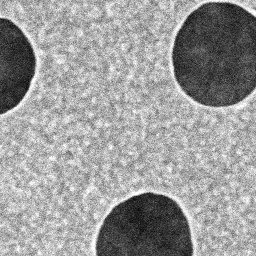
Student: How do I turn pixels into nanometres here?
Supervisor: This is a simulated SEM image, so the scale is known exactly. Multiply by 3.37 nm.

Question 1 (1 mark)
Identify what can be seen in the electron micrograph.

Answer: holes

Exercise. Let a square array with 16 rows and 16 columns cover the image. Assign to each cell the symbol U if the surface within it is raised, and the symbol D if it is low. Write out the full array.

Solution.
UUUUUUUUUUUUDDDU
DUUUUUUUUUUDDDDD
DDUUUUUUUUUDDDDD
DDUUUUUUUUUDDDDD
DDUUUUUUUUUDDDDD
DDUUUUUUUUUDDDDD
DUUUUUUUUUUUDDDU
UUUUUUUUUUUUUUUU
UUUUUUUUUUUUUUUU
UUUUUUUUUUUUUUUU
UUUUUUUUUUUUUUUU
UUUUUUUUUUUUUUUU
UUUUUUUUDDDUUUUU
UUUUUUUDDDDDUUUU
UUUUUUDDDDDDUUUU
UUUUUUDDDDDDUUUU